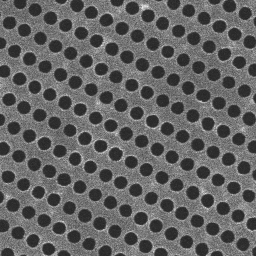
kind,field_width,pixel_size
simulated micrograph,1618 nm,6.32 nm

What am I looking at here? a regular array of holes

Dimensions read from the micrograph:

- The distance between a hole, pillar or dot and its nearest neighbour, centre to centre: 107 nm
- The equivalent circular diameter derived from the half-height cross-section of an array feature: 83.2 nm